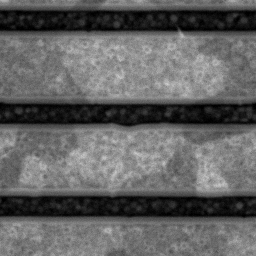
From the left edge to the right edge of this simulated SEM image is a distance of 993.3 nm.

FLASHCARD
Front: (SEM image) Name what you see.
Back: one or a few lines or trenches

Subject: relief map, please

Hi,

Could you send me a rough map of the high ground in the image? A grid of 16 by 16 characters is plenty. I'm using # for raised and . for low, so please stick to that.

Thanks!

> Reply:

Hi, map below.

................
................
################
################
################
################
................
................
################
################
################
################
................
................
################
################